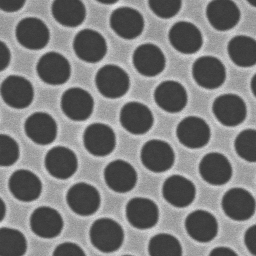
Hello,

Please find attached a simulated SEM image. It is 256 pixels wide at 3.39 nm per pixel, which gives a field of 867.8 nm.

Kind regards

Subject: a regular array of holes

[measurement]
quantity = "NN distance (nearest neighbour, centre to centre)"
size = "142 nm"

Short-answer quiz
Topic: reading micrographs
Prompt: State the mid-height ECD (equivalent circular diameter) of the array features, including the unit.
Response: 112 nanometres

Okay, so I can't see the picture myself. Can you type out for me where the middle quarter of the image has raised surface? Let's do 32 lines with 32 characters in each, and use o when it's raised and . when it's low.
..oooooooo...oooo........ooooooo
..ooooooo......ooo.......ooooooo
..oooooo........ooo.....oooooooo
.ooooooo........oooooooooooooooo
oooooooo........ooooooooo...oooo
oooooooo........ooooooo.......oo
o....oooo.......ooooooo.......oo
......ooo......ooooooo.........o
.......oooo...ooooooooo........o
.......oooooooooo.ooooo........o
.......oooooooo.....oooo......oo
.......ooooooo........ooo....ooo
.......ooooooo........oooooooooo
o.....oooooooo........oooooooo..
oooooooooooooo........ooooooo...
oooooo.....oooo.......oooooo....
ooooo.......oooo.....ooooooo....
ooooo........oooo...oooooooo....
ooooo........ooooooooooooooo....
ooooo........oooooooo....oooo...
ooooo........ooooooo.......ooo..
..oooo......ooooooo........ooooo
...oooo....oooooooo.........oooo
...oooooooooooooooo.........oooo
...ooooooooo....ooo........ooooo
...oooooooo......ooo.......ooooo
...ooooooo........ooo.....oooooo
..oooooooo........oooooooooooooo
.ooooooooo........oooooooo....oo
oooooooooo........ooooooo.......
oo.....oooo.......ooooooo.......
o.......oooo.....ooooooo........